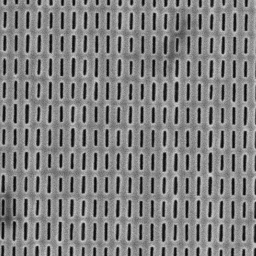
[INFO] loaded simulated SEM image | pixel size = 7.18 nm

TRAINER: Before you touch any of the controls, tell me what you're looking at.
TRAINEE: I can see a regular array of holes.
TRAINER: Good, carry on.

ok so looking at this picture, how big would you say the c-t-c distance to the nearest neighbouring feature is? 80.6 nm